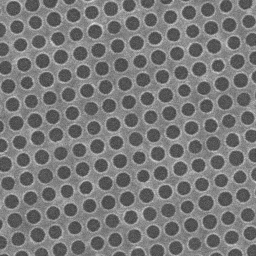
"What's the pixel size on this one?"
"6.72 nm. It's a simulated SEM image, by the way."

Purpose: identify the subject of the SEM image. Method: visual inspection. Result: a regular array of holes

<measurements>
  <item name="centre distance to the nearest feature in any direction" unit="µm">0.125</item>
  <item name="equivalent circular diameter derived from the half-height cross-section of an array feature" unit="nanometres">98.3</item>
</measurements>